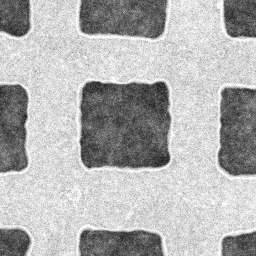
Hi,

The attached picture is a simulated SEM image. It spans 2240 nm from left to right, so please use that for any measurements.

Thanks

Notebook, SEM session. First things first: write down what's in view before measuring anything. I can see holes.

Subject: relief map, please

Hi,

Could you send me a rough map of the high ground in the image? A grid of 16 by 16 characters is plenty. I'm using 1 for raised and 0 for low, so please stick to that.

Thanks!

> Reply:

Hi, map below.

0011100000011100
0011100000111100
1111111111111111
1111111111111111
1111111111111111
0111100000011101
0011100000011100
0011100000011100
0011100000011100
0011100000011100
0011111000111100
1111111111111111
1111111111111111
1111111111111111
0011100001111111
0011100000111100